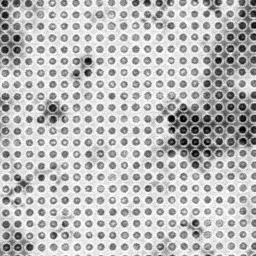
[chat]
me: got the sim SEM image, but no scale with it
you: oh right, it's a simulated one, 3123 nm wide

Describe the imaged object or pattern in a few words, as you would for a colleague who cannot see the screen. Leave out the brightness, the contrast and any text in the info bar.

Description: a regular array of holes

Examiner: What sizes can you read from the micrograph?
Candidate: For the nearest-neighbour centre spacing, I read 0.139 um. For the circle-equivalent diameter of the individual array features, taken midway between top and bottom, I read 8.37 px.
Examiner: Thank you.